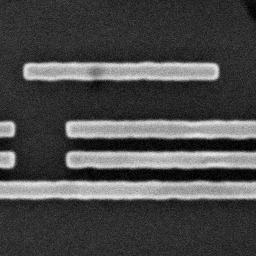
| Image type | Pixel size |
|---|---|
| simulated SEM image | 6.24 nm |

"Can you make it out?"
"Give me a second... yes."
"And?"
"wiring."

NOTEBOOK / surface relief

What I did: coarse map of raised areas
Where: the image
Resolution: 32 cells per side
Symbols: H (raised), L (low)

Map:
LLLLLLLLLLLLLLLLLLLLLLLLLLLLLLLL
LLLLLLLLLLLLLLLLLLLLLLLLLLLLLLLL
LLLLLLLLLLLLLLLLLLLLLLLLLLLLLLLL
LLLLLLLLLLLLLLLLLLLLLLLLLLLLLLLL
LLLLLLLLLLLLLLLLLLLLLLLLLLLLLLLL
LLLLLLLLLLLLLLLLLLLLLLLLLLLLLLLL
LLLLLLLLLLLLLLLLLLLLLLLLLLLLLLLL
LLLLLLLLLLLLLLLLLLLLLLLLLLLLLLLL
LLLHHHHHHHHHHHHHHHHHHHHHHHHLLLLL
LLLHHHHHHHHHHHHHHHHHHHHHHHHLLLLL
LLLLLLLLLLLLLLLLLLLLLLLLLLLLLLLL
LLLLLLLLLLLLLLLLLLLLLLLLLLLLLLLL
LLLLLLLLLLLLLLLLLLLLLLLLLLLLLLLL
LLLLLLLLLLLLLLLLLLLLLLLLLLLLLLLL
LLLLLLLLLLLLLLLLLLLLLLLLLLLLLLLL
HHLLLLLLHHHHHHHHHHHHHHHHHHHHHHHH
HHLLLLLLHHHHHHHHHHHHHHHHHHHHHHHH
LLLLLLLLLLLLLLLLLLLLLLLLLLLLLLLL
LLLLLLLLLLLLLLLLLLLLLLLLLLLLLLLL
HHLLLLLLHHHHHHHHHHHHHHHHHHHHHHHH
HHLLLLLLHHHHHHHHHHHHHHHHHHHHHHHH
LLLLLLLLLLLLLLLLLLLLLLLLLLLLLLLL
LLLLLLLLLLLLLLLLLLLLLLLLLLLLLLLL
HHHHHHHHHHHHHHHHHHHHHHHHHHHHHHHH
HHHHHHHHHHHHHHHHHHHHHHHHHHHHHHHH
LLLLLLLLLLLLLLLLLLLLLLLLLLLLLLLL
LLLLLLLLLLLLLLLLLLLLLLLLLLLLLLLL
LLLLLLLLLLLLLLLLLLLLLLLLLLLLLLLL
LLLLLLLLLLLLLLLLLLLLLLLLLLLLLLLL
LLLLLLLLLLLLLLLLLLLLLLLLLLLLLLLL
LLLLLLLLLLLLLLLLLLLLLLLLLLLLLLLL
LLLLLLLLLLLLLLLLLLLLLLLLLLLLLLLL